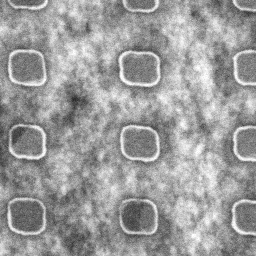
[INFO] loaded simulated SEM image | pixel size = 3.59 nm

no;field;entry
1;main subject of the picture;raised bodies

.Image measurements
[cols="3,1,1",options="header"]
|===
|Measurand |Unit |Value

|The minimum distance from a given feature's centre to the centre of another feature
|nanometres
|266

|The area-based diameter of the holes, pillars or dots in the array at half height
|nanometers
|136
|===